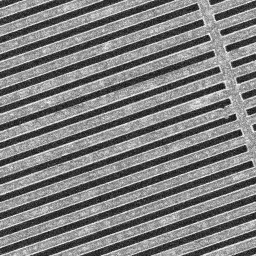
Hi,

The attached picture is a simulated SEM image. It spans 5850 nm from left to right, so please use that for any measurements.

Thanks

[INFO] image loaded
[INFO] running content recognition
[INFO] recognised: parallel lines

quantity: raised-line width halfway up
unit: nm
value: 202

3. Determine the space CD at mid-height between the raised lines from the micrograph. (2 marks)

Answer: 181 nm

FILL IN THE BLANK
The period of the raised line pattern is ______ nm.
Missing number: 380